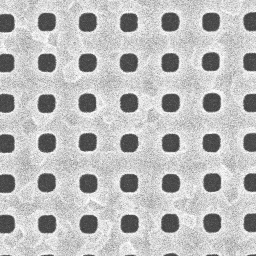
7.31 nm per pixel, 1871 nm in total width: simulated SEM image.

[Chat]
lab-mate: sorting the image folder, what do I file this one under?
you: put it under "a regular array of holes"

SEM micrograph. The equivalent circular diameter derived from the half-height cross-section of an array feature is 147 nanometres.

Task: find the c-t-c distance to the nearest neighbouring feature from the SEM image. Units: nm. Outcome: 293